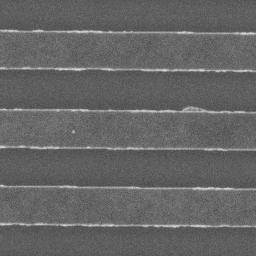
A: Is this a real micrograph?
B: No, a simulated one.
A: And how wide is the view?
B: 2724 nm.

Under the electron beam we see lines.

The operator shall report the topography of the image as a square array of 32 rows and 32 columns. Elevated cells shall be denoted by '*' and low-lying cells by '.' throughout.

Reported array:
................................
................................
................................
................................
********************************
********************************
********************************
********************************
********************************
................................
................................
................................
................................
................................
********************************
********************************
********************************
********************************
.............*******************
................................
................................
................................
................................
******************..............
********************************
********************************
********************************
********************************
................................
................................
................................
................................